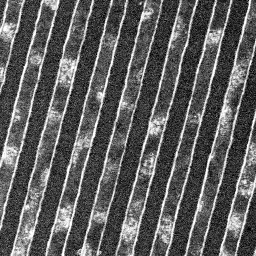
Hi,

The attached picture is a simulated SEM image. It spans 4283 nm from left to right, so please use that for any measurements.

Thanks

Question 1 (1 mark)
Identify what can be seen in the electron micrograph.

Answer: parallel lines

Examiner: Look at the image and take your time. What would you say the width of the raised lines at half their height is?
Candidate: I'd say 259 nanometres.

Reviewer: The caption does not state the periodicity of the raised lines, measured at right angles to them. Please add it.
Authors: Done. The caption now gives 562 nm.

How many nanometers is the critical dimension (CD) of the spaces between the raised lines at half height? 304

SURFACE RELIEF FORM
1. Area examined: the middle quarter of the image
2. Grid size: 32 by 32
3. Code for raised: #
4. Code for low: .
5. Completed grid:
###.....####....####.....####...
###.....####....####.....####...
###....####.....####.....####...
##.....####.....####....####....
##.....####.....###.....####....
##....####.....####.....####....
##....####.....####.....####....
#.....####.....####....#####....
#.....####....#####....####.....
#....####.....####.....####.....
#....####.....####.....####....#
.....####.....####....####.....#
.....####.....###.....####.....#
.....###.....####.....####.....#
....####.....####....#####....##
....####.....####....####.....##
....####....####.....####.....##
...#####....####.....####....###
...####.....####.....###.....###
...####.....####....####.....###
...####....####.....####.....###
..####.....####.....####....####
..####.....####.....###.....####
..####.....####....####.....####
..###.....####.....####.....####
.####.....####.....####....####.
.####.....####.....###.....####.
.####.....####....####.....####.
.###.....####.....####....#####.
####.....####.....####....####..
####.....####....####.....####..
####.....####....####.....####..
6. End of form